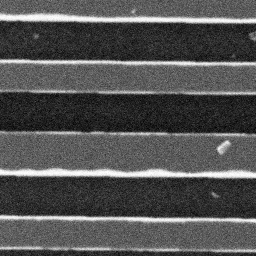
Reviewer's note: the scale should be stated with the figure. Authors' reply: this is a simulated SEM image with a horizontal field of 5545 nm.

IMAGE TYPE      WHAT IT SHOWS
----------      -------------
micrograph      lines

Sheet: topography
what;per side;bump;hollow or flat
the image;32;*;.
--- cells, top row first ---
********************************
********************************
............********************
................................
................................
................................
................................
................................
********************************
********************************
********************************
............********************
................................
................................
................................
................................
................................
********************************
********************************
********************************
********************************
********************************
................................
................................
................................
................................
................................
********************************
********************************
********************************
********************************
................................